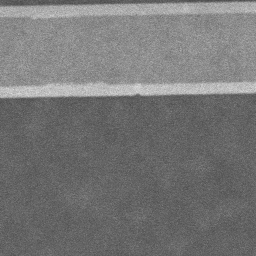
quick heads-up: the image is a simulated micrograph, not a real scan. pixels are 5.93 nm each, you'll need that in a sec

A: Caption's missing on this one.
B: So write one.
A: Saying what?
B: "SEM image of one or a few lines or trenches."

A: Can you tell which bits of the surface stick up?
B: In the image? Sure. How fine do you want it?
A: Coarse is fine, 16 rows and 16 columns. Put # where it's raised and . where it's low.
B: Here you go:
...........#.###
################
################
################
################
###############.
................
................
................
................
................
................
................
................
................
................